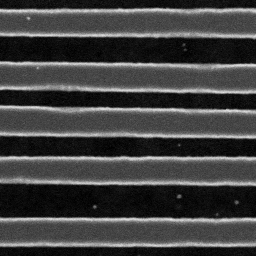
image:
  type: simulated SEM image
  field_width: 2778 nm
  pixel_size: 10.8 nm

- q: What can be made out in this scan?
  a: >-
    lines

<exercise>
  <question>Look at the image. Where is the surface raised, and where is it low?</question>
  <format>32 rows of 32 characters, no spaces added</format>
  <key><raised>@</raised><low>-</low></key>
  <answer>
--------------------------------
@@@@@@@@@@@@@@@@@@@@@@@@@@@@@@@@
@@@@@@@@@@@@@@@@@@@@@@@@@@@@@@@@
@@@@@@@@@@@@@@@@@@@@@@@@@@@@@@@@
-----@----@@@@@--@@@------@@@@@@
--------------------------------
--------------------------------
--------------------------------
@@@@@@@@@@@@@@@@@@@@@@@@@@@@@@@@
@@@@@@@@@@@@@@@@@@@@@@@@@@@@@@@@
@@@@@@@@@@@@@@@@@@@@@@@@@@@@@@@@
--------------------------@@@@@@
--------------------------------
@@@@@@--------------------------
@@@@@@@@@@@@@@@@@@@@@@@@@@@@@@@@
@@@@@@@@@@@@@@@@@@@@@@@@@@@@@@@@
@@@@@@@@@@@@@@@@@@@@@@@@@@@@@@@@
--------------------------------
--------------------------------
--------------------------------
@@@@@@@@@@@@@@@@@@@@@@@@@@@@@@@@
@@@@@@@@@@@@@@@@@@@@@@@@@@@@@@@@
@@@@@@@@@@@@@@@@@@@@@@@@@@@@@@@@
--------------------------------
--------------------------------
--------------------------------
--------------------------------
@@@@@@@@@@@@@@@@@@@@@@@@@@@@@@@@
@@@@@@@@@@@@@@@@@@@@@@@@@@@@@@@@
@@@@@@@@@@@@@@@@@@@@@@@@@@@@@@@@
@@@@@@@@@@@@@@@@@@@@@@@@@@@@@@@@
--------------------------------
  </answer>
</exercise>